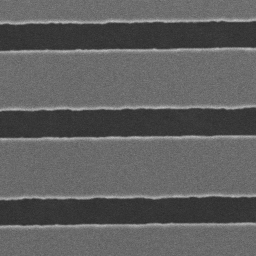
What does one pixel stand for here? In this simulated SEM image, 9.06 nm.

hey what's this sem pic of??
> lines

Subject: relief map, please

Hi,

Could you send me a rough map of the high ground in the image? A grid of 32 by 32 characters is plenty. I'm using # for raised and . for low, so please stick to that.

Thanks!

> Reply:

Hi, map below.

################################
################################
################################
................................
................................
................................
################################
################################
################################
################################
################################
################################
################################
########################.#####..
................................
................................
................................
################################
################################
################################
################################
################################
################################
################################
################################
................................
................................
................................
################################
################################
################################
################################